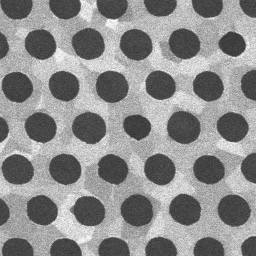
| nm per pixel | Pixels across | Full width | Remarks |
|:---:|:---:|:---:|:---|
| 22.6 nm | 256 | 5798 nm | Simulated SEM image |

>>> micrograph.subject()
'a regular array of holes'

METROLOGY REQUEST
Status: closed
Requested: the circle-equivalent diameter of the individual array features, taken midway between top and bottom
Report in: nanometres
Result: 716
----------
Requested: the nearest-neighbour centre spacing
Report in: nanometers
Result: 1070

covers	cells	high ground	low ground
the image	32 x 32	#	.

....##....##....##....##....##..
....##....##....###...###...##..
################################
################################
.##....##....##....##....###..##
.##....##....##....##....##....#
.##....##....##....##....###..##
#####.###########.##############
################################
#..###...###....##...####..###..
....##....##....##....##....##..
....##....##....##....##....##..
#..####..####..##########..####.
################################
####..####..####..###...####..##
.##....##....##....##....##....#
.##....##....###...##....##....#
.###..####...####.####..####..##
################################
#..####..####..####..####..####.
....##....##....##....##....##..
....##....##....##....##....##..
#...###...###...###...###...###.
################################
#####.##########..####..####..##
.##....##....##....##....##....#
.##....##....##....##....##....#
.###...###...###...###...###...#
################################
################################
....###...##....##....##....##..
....##....##....##....##....##..